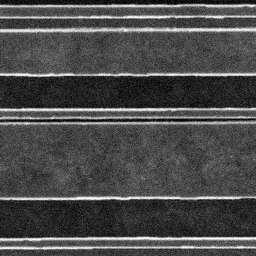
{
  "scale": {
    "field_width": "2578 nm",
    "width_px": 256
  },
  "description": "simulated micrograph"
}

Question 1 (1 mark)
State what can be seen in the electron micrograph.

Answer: lines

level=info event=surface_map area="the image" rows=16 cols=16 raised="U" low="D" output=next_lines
UUUUUUUUUUUUUUUU
UUUUUUUUUUUUUUUU
UUUUUUUUUUUUUUUU
UUUUUUUUUUUUUUUU
UUUUUUUUUUUUUUUU
DDDDDDDDDDDDDDDD
DDDDDDDDDDDDDDDD
UUUUUUUUUUUUUUUU
UUUUUUUUUUUUUUUU
UUUUUUUUUUUUUUUU
UUUUUUUUUUUUUUUU
UUUUUUUUUUUUUUUU
DDDDDDDDDDDDDDDD
DDDDDDDDDDDDDDDD
DDDDDDDDDDDDDDDD
UUUUUUUUUUUUUUUU